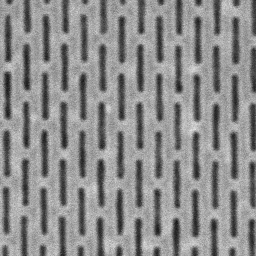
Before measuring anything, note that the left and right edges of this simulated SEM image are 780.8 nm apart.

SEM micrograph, a regular array of holes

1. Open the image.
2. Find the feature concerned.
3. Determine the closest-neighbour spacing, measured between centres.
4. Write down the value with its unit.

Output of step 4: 103 nm